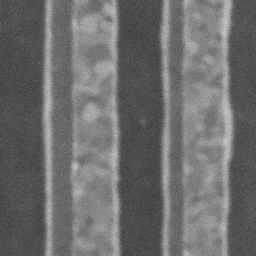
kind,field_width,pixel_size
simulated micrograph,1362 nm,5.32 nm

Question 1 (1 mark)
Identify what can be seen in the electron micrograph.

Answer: lines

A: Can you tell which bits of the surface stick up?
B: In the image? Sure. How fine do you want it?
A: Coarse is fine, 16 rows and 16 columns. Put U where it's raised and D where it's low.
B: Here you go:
DDDUUUUDDDUUUUDD
DDDUUUUDDDUUUUDD
DDDUUUUDDDUUUUDD
DDDUUUUDDDUUUUDD
DDDUUUUDDDUUUUDD
DDDUUUUDDDUUUUDD
DDDUUUUDDDUUUUDD
DDDUUUUDDDUUUUDD
DDDUUUUDDDUUUUDD
DDDUUUUDDDUUUUDD
DDDUUUUDDDUUUUDD
DDDUUUUDDDUUUUDD
DDDUUUUDDDUUUUDD
DDDUUUUDDDUUUUDD
DDDUUUUDDDUUUUDD
DDDUUUUDDDUUUUDD